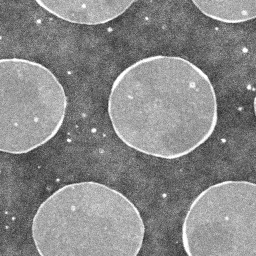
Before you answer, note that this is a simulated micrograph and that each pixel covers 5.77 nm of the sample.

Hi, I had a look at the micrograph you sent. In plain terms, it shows raised bodies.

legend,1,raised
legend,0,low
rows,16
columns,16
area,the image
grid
0001111100001111
0000010000000000
0000000000000000
0000000000000000
1110000011111000
1111000111111000
1111000111111000
1111000111111000
1110000111111000
1100000001110000
0000000000000000
0000010000000011
0001111100001111
0011111110001111
0011111110001111
0011111110001111